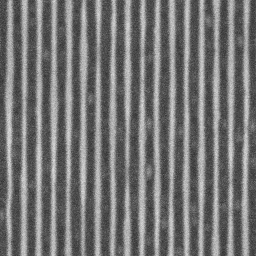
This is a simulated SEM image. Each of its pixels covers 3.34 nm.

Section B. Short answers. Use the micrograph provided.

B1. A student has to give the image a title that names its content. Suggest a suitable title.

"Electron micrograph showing parallel lines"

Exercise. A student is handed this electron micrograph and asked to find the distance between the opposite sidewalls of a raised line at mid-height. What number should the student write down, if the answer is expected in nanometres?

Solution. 12.1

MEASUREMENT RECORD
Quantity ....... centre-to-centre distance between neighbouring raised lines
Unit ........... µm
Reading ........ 0.0494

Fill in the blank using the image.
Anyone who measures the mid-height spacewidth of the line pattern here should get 35.5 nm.